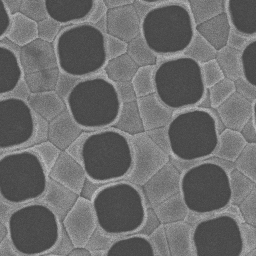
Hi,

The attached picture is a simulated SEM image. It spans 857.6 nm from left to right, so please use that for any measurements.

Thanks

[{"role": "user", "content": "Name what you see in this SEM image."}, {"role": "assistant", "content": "a regular array of holes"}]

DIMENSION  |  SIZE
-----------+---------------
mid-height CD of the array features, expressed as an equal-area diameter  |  164 nanometres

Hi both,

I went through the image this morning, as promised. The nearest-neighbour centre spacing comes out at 0.182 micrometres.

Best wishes